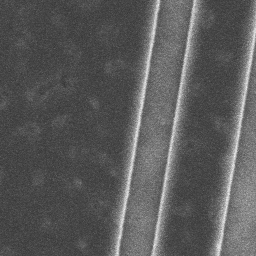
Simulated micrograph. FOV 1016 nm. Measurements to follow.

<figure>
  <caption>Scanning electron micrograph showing one or a few lines or trenches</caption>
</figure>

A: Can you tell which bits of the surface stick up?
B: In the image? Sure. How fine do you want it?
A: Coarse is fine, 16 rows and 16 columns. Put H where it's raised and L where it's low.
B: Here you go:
HHHHHHHHHHLLHHHH
HHHHHHHHHHLLHHHH
HHHHHHHHHHLLHHHH
HHHHHHHHHLLLHHHH
HHHHHHHHHLLHHHHH
HHHHHHHHHLLHHHHL
HHHHHHHHHLLHHHHL
HHHHHHHHHLLHHHHL
HHHHHHHHHLLHHHHL
HHHHHHHHLLLHHHHL
HHHHHHHHLLHHHHHL
HHHHHHHHLLHHHHLL
HHHHHHHHLLHHHHLL
HHHHHHHHLLHHHHLL
HHHHHHHHLLHHHHLL
HHHHHHHLLLHHHHLL